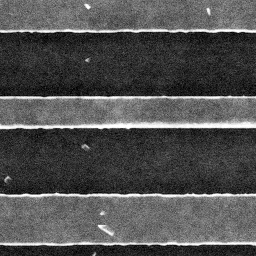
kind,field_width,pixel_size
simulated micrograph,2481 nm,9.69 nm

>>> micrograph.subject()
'lines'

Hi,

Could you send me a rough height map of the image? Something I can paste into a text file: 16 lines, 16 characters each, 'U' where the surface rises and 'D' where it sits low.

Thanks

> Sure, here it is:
UUUUUUUUUUUUUUUU
UUUUUUUUUUUUUUUU
DDDDDDDDDDDDDDDD
DDDDDDDDDDDDDDDD
DDDDDDDDDDDDDDDD
DDDDDDDDDDDDDDDD
UUUUUUUUUUUUUUUU
UUUUUUUUUUUUUUUU
DDDDDDDDDDDDDDDD
DDDDDDDDDDDDDDDD
DDDDDDDDDDDDDDDD
DDDDDDDDDDDDDDDD
UUUUUUUUUUUUUUUU
UUUUUUUUUUUUUUUU
UUUUUUUUUUUUUUUU
DDDDDDDDDDDDDDDD